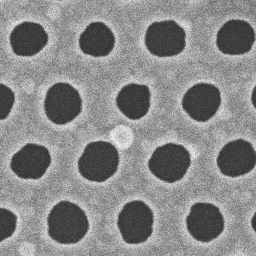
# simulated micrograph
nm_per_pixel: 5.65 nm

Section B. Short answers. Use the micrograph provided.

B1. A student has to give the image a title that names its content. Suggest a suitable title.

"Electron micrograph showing a regular array of holes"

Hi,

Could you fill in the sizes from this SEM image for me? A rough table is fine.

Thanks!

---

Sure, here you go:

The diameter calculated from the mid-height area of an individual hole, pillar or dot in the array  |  222 nm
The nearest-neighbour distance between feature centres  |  385 nanometres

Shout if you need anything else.